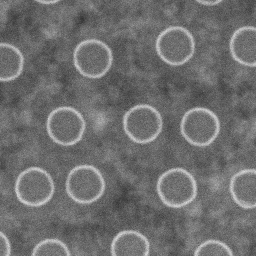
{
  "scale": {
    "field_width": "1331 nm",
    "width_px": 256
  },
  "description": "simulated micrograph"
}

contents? a regular array of raised bodies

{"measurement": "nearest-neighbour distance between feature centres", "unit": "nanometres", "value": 308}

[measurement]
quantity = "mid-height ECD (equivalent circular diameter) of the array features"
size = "191 nm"